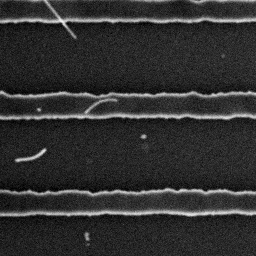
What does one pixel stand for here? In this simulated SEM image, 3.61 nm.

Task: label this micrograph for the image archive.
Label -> lines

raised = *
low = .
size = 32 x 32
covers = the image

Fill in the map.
********************************
********************************
********************************
................................
................................
................................
................................
................................
................................
................................
................................
................................
********************************
********************************
********************************
................................
................................
................................
................................
................................
................................
................................
................................
................................
********************************
********************************
********************************
................................
................................
................................
................................
................................